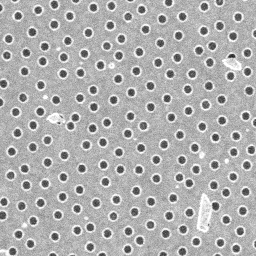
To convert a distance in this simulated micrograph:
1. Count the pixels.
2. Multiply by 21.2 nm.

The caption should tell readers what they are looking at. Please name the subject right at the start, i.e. a regular array of holes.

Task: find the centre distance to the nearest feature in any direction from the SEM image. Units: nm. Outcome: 368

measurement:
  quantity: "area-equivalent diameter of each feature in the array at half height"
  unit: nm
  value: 187